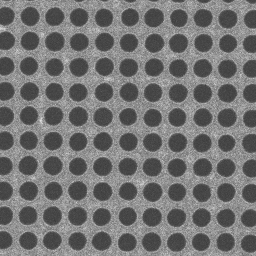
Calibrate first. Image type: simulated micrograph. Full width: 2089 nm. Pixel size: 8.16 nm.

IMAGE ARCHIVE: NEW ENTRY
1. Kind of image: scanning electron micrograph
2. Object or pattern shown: a regular array of holes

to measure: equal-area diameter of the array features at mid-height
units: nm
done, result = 145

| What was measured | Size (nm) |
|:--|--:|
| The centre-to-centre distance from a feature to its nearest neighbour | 198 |